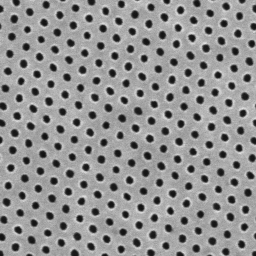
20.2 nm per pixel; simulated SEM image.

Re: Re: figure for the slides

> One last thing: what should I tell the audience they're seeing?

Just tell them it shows a regular array of holes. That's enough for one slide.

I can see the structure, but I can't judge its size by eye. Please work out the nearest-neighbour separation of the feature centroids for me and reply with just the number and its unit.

0.34 micrometres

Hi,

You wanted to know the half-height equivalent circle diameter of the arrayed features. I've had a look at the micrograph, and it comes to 0.164 um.